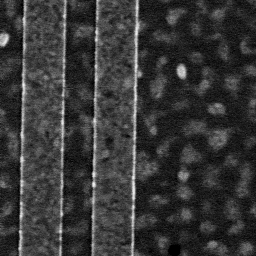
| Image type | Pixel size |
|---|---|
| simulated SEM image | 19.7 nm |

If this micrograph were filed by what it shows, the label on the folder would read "one or a few lines or trenches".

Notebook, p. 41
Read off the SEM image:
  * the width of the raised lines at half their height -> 817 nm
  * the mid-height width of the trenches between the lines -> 608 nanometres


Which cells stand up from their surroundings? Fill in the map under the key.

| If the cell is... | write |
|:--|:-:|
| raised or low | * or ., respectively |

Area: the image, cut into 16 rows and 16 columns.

..**..***.......
.***..***.......
.***..***.......
.***..***.......
.***..***.......
.***..**........
.***..**........
.***..**........
.***..**........
.***..**........
.***..**........
.***..**........
.***..**........
.***..**........
.***..**........
.***..**........